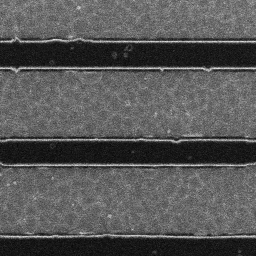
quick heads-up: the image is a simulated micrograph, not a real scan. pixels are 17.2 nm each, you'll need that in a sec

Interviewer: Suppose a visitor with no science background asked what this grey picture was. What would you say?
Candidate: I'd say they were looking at one or a few lines or trenches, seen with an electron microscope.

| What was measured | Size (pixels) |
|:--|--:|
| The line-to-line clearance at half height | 70.5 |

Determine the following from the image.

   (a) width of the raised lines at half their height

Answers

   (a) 462 nm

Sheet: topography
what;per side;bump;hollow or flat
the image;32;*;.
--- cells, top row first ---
................................
................................
................................
................................
................................
********************************
********************************
********************************
********************************
................................
................................
................................
................................
................................
................................
................................
................................
*******************....********.
********************************
********************************
********************************
................................
................................
................................
................................
................................
................................
................................
................................
.......*....******..............
********************************
********************************